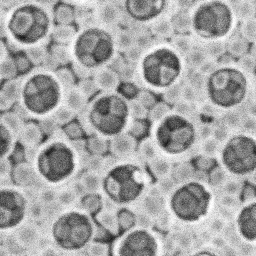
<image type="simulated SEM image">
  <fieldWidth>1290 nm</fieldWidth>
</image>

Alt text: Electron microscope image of a regular array of holes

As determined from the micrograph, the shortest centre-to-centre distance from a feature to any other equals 0.217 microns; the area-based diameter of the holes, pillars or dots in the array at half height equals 181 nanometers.